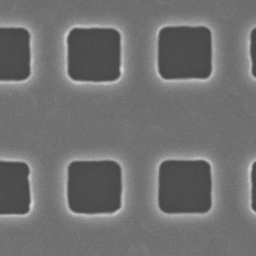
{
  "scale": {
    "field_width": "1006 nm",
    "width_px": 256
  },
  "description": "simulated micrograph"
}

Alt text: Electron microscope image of holes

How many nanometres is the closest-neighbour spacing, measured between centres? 356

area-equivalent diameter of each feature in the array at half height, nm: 231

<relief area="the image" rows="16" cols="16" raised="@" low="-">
@@@@@@@@@@@@@@@@
@@@@@@@@@@@@@@@@
--@@---@@@---@@@
--@@----@@---@@@
--@@---@@@---@@@
@@@@@@@@@@@@@@@@
@@@@@@@@@@@@@@@@
@@@@@@@@@@@@@@@@
@@@@@@@@@@@@@@@@
@@@@@@@@@@@@@@@@
--@@---@@@---@@@
--@@----@@---@@@
--@@----@@---@@@
@@@@@@@@@@@@@@@@
@@@@@@@@@@@@@@@@
@@@@@@@@@@@@@@@@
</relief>